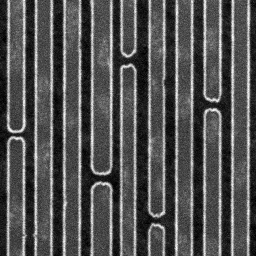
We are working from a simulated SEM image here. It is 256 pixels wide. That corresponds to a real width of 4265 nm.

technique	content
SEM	parallel lines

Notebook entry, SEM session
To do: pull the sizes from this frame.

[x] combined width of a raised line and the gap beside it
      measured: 467 nm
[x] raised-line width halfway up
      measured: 204 nanometers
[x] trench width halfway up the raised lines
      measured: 0.263 µm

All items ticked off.